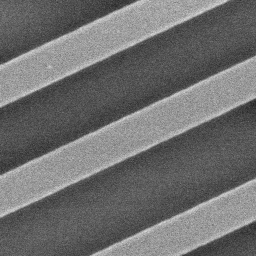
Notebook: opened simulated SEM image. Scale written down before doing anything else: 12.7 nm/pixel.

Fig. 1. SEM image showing lines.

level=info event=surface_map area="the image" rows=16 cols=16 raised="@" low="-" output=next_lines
--------@@@@@---
------@@@@@-----
---@@@@@@-------
-@@@@@@---------
@@@@@---------@@
@@@---------@@@@
----------@@@@@-
-------@@@@@@---
-----@@@@@@-----
---@@@@@@-------
-@@@@@@---------
@@@@@----------@
@@-----------@@@
-----------@@@@@
---------@@@@@--
-------@@@@@----